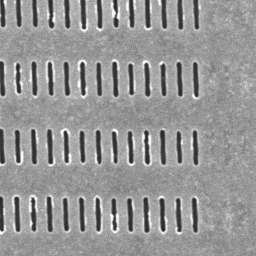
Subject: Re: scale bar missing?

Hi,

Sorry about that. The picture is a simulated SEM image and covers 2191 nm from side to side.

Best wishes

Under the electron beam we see a regular array of holes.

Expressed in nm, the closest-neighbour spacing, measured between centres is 138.